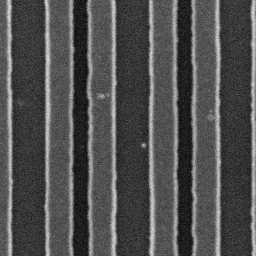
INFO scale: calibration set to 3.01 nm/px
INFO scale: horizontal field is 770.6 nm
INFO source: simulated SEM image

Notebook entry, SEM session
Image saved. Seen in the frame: lines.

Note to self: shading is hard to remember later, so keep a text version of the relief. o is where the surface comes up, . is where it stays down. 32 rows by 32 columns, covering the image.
o.....ooo..ooo.....ooo..ooo.....
o.....ooo..ooo.....ooo..ooo.....
o.....ooo..ooo.....ooo..ooo.....
o.....ooo..ooo.....ooo..ooo.....
o.....ooo..ooo.....ooo..ooo.....
o.....ooo..ooo.....ooo..ooo.....
o.....ooo..ooo.....ooo..ooo.....
o.....ooo..ooo.....ooo..ooo.....
o.....ooo..ooo.....ooo..ooo.....
o.....ooo..ooo.....ooo..ooo.....
o.....ooo..ooo.....ooo..ooo.....
o.....ooo..ooo.....ooo..ooo.....
o.....ooo..ooo.....ooo..ooo.....
o.....ooo..ooo.....ooo..ooo.....
o.....ooo..ooo.....ooo..ooo.....
o.....ooo..ooo.....ooo..ooo.....
o.....ooo..ooo.....ooo..ooo.....
o.....ooo..ooo.....ooo..ooo.....
o.....ooo..ooo.....ooo..ooo.....
o.....ooo..ooo.....ooo..ooo.....
o.....ooo..ooo.....ooo..ooo.....
o.....ooo..ooo.....ooo..ooo.....
o.....ooo..ooo.....ooo..ooo.....
o.....ooo..ooo.....ooo..ooo.....
o.....ooo..ooo.....ooo..ooo.....
o.....ooo..ooo.....ooo..ooo.....
o.....ooo..ooo.....ooo..ooo.....
o.....ooo..ooo.....ooo..ooo.....
o.....ooo..ooo.....ooo..ooo.....
o.....ooo..ooo.....ooo..ooo.....
o.....ooo..ooo.....ooo..ooo.....
o.....ooo..ooo.....ooo..ooo.....